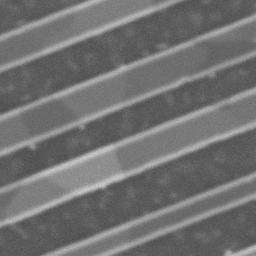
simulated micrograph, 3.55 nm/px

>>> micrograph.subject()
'one or a few lines or trenches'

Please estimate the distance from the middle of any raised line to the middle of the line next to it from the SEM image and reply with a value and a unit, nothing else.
250 nm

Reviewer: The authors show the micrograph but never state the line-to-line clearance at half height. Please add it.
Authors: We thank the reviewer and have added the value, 156 nm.